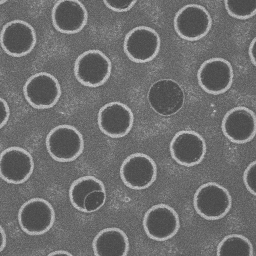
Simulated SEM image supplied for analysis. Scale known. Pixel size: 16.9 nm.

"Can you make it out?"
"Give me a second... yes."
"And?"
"a regular array of raised bodies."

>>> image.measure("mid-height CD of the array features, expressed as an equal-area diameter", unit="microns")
0.569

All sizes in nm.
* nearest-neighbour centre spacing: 927